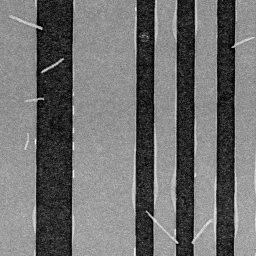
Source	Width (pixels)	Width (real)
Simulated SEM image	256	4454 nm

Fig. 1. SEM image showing groups of lines, slits or small figures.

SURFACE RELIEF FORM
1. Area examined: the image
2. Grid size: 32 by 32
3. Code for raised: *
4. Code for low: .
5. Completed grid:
*****....********..***..***...**
*****....********..***..***...**
****.....********...**..***...**
*****....********...**..***...**
****.....********..***..***..***
****.....********..***..***..***
****.....********..***..***...**
****.....********..***..***...**
****.....********..***..***...**
****.....********..***..***...**
****.....********..***..***..***
****.....********..***..***..***
*****....********..***..***..***
****.....********..***..***..***
****.....********..***..***..***
****.....********..***..***..***
****.....********..***..***..***
****.....********..***..***..***
****.....********..***..***..***
****.....********..***..***..***
****.....********..***..***..***
****.....********..***..***..***
****.....********..***..***..***
****.....********..***..***...**
****.....********..***..***..***
****.....********..***..***..***
****.....********..***..***...**
****.....********..***..***...**
****.....********..***..***...**
****.....********..***..***..***
****.....********..***..***..***
****.....********..***..***..***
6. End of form